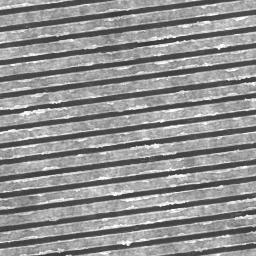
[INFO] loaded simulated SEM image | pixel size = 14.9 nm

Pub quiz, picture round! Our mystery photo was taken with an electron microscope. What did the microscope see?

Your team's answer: parallel lines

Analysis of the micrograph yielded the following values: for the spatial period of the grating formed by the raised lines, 247 nm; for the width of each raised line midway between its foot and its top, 0.161 micrometres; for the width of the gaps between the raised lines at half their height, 0.0813 µm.